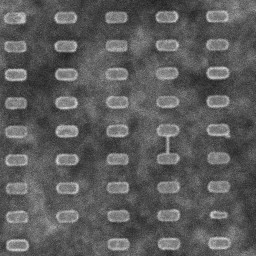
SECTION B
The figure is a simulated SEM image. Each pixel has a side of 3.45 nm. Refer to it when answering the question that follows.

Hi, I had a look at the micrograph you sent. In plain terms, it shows a regular array of raised bodies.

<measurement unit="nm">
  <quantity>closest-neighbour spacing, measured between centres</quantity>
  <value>97.9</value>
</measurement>